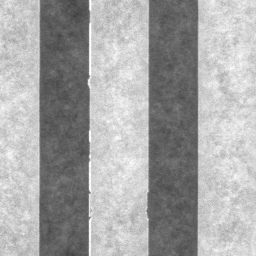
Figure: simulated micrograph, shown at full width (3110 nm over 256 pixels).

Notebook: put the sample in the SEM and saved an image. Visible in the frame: one or a few lines or trenches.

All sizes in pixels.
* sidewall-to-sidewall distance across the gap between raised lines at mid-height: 51.1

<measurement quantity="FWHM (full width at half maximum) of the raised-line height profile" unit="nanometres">703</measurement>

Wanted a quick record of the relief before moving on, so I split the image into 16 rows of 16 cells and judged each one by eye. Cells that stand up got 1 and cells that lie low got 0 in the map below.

1100001110001111
1100001110001111
1100001110001111
1100001110001111
1100001110001111
1100001110001111
1100001110001111
1100001110001111
1100001110001111
1100001110001111
1100001110001111
1100001110001111
1100001110001111
1100001110001111
1100001110001111
1100001110001111